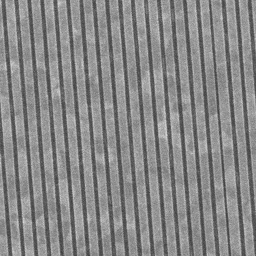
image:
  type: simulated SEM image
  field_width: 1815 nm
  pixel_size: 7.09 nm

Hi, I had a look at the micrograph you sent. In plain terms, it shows parallel lines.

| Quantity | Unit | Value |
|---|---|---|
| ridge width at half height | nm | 57.4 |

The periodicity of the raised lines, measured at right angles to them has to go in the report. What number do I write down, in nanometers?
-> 91.5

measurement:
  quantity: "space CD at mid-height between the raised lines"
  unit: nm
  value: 33.5